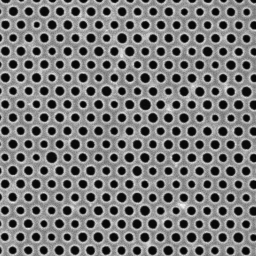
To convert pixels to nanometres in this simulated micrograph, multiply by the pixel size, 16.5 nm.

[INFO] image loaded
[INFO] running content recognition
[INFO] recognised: a regular array of holes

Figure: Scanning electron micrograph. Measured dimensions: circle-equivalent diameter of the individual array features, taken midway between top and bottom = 0.141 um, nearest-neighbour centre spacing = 249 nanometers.